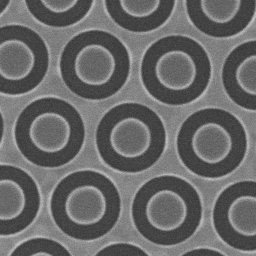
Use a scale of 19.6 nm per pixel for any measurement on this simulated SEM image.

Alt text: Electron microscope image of an array of small figures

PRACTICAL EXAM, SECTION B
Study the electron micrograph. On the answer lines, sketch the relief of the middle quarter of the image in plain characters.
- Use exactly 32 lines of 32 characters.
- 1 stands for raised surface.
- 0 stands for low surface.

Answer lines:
00011111111100000110000111111111
00011111111100000110000111111111
00011111111100001110000111111111
00001111111000001110000011111111
00000111110000001110000011111111
00000000000000011111000000111110
10000000000000111111000000000000
11100000000001111111100000000000
11111000000111111111110000000000
01111111111111111111111100000000
00111111111110000000111111111111
00011111111000000000001111111111
00001111110000000000000111111111
00000111100000000000000011111110
10000111100000111110000001111100
10000111000001111111000001111000
10000111000011111111100001111000
10000111000011111111100000110000
10000111000011111111100000110000
10000111000011111111100000110000
00000111000011111111100000110000
00001111000001111111000001110000
00001111100000111110000011110000
00011111100000000000000011111000
01111111110000000000000111111000
11111111111000000000001111111100
11110001111110000000111111111110
10000000001111111111111111111111
00000000000111111111110000000111
00000000000011111111000000000001
00000000000001111110000000000000
00011111000001111100000000000000